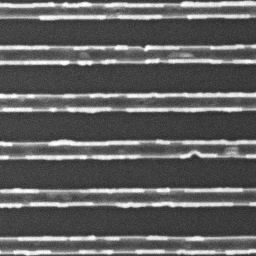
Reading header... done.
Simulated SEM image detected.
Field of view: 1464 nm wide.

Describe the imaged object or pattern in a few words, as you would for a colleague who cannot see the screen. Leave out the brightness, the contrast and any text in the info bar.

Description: parallel lines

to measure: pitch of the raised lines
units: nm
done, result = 268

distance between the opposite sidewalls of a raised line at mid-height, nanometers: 96.5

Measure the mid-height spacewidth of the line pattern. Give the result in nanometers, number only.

172